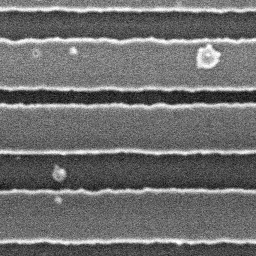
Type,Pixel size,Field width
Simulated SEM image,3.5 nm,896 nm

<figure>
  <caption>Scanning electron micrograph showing lines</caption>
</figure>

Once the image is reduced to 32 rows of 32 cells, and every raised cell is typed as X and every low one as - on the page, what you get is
XXXXXXXXXXXXXXXXXXXXXXXXXXXXXXXX
---------------------------X----
--------------------------------
--------------------------------
--------------------------------
XXXXXXXXXXXXXXXXXXXXXXXXXXXXXXXX
XXXXXXXXXXXXXXXXXXXXXXXXXXXXXXXX
XXXXXXXXXXXXXXXXXXXXXXXXXXXXXXXX
XXXXXXXXXXXXXXXXXXXXXXXXXXXXXXXX
XXXXXXXXXXXXXXXXXXXXXXXXXXXXXXXX
XXXXXXXXXXXXXXXXXXXXXXXXXXXXXXXX
--------------------------------
--------------------------------
XXXXXXXXXXXXXXXXXXXXXXXXXXXXXXXX
XXXXXXXXXXXXXXXXXXXXXXXXXXXXXXXX
XXXXXXXXXXXXXXXXXXXXXXXXXXXXXXXX
XXXXXXXXXXXXXXXXXXXXXXXXXXXXXXXX
XXXXXXXXXXXXXXXXXXXXXXXXXXXXXXXX
XXXXXXXXXXXXXXXXXXXXXXXXXXXXXXXX
--------------------------------
--------------------------------
--------------------------------
--------------------------------
--------------------------------
XXXXXXXXXXXXXXXXXXXXXXXXXXXXXXXX
XXXXXXXXXXXXXXXXXXXXXXXXXXXXXXXX
XXXXXXXXXXXXXXXXXXXXXXXXXXXXXXXX
XXXXXXXXXXXXXXXXXXXXXXXXXXXXXXXX
XXXXXXXXXXXXXXXXXXXXXXXXXXXXXXXX
XXXXXXXXXXXXXXXXXXXXXXXXXXXXXXXX
--------------------------------
--------------------------------